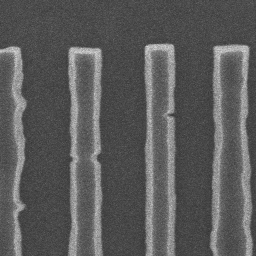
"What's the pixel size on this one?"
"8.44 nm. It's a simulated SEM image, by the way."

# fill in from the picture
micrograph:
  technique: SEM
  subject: one or a few lines or trenches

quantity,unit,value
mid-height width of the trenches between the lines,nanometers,434